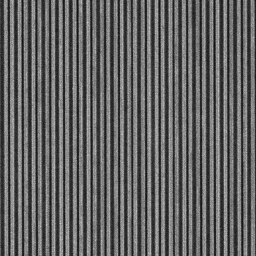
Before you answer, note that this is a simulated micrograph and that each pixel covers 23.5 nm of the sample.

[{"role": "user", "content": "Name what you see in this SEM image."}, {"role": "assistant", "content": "parallel lines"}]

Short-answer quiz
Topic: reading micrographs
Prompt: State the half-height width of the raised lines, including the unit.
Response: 85.2 nm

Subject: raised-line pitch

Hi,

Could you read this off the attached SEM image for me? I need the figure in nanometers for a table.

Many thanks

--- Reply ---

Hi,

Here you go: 161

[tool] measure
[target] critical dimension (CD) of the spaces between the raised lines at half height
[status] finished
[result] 0.0852 micrometres